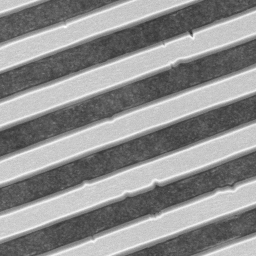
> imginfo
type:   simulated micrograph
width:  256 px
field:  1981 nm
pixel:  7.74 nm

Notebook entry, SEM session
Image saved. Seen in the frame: parallel lines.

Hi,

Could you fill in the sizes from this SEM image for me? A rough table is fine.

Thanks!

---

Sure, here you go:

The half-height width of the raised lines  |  192 nm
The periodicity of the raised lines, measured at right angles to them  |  411 nm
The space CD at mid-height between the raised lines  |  221 nanometres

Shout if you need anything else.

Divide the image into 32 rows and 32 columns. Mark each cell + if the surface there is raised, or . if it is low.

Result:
++++...........++++++++.........
+...........+++++++++..........+
.........+++++++++..........++++
......+++++++++...........++++++
...+++++++++...........+++++++++
.++++++++...........+++++++++...
+++++++..........+++++++++......
++++..........+++++++++.........
+...........+++++++++..........+
.........+++++++++...........+++
......+++++++++...........++++++
...++++++++++..........+++++++++
.+++++++++..........+++++++++...
+++++++..........+++++++++......
++++...........+++++++++........
++..........+++++++++..........+
.........+++++++++...........+++
.......+++++++++..........++++++
....+++++++++..........+++++++++
.+++++++++...........++++++++...
+++++++...........+++++++++.....
+++++..........+++++++++........
++..........+++++++++...........
.........++++++++++..........+++
.......++++++++...........++++++
....+++++++++..........+++++++++
.+++++++++...........+++++++++..
+++++++...........+++++++++.....
+++++..........+++++++++........
++..........+++++++++...........
..........+++++++++..........+++
.......+++++++++..........++++++